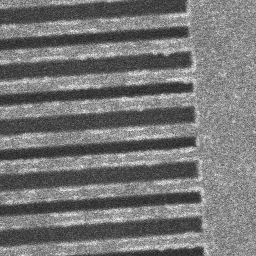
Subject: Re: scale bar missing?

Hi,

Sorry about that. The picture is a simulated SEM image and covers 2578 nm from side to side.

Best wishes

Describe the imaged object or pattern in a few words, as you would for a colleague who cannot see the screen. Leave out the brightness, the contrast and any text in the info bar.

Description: parallel lines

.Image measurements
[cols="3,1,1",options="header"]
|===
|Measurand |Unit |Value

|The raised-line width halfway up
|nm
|148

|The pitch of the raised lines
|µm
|0.277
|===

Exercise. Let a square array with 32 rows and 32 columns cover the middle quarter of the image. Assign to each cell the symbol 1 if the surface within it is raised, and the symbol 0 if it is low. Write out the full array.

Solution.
00000000000000000000000000000000
00000000000000000000101111111111
00000000111111111111111111111111
11111111111111111111111111111111
11111111111111111111111111111011
11111111111111100000000000000000
10000000000000000000000000000000
00000000000000000000000010111111
00000000000011111111111111111111
11111111111111111111111111111111
11111111111111111111111111111111
11111111111111111111000000000000
11111000000000000000000000000000
00000000000000000000000000000000
00000000000000000000000000000000
00000000000000000000111111111111
00000011111111111111111111111111
11111111111111111111111111111111
11111111111111111111111111100000
11111111111100000000000000000000
00000000000000000000000000000000
00000000000000000000000011111111
00000000011111111111111111111111
11111111111111111111111111111111
11111111111111111111111111111100
11111111111110010000000000000000
11000000000000000000000000000000
00000000000000000000000000000000
00000000000000000000000000000000
00000000000000000111111111111111
00011111111111111111111111111111
11111111111111111111111111111111